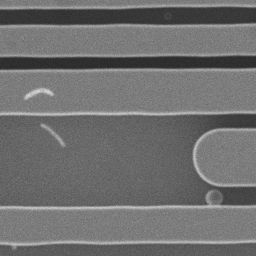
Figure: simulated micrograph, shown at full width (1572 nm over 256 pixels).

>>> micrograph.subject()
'groups of lines, slits or small figures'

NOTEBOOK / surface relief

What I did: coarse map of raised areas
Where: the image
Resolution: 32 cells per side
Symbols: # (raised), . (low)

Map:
################################
................................
................................
################################
################################
################################
################################
................................
................................
################################
################################
################################
################################
################################
................................
................................
..........................######
.........................#######
........................########
........................########
........................########
.........................#######
..........................######
................................
................................
................................
################################
################################
################################
################################
.####...........................
................................